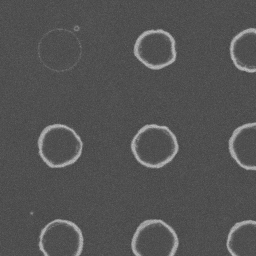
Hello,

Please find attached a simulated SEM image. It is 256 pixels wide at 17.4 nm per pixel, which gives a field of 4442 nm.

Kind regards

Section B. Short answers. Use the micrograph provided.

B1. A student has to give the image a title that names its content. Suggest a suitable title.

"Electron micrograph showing raised bodies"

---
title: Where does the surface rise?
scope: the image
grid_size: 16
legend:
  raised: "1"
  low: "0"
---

0000000000000000
0000000000000000
0000000001100001
0000000001100001
0000000000000000
0000000000000000
0000000000000000
0000000000000000
0001100001100001
0001100011100001
0000000000000000
0000000000000000
0000000000000000
0000000000000000
0001100001100001
0001100011100011